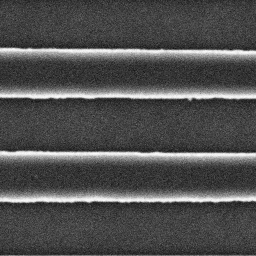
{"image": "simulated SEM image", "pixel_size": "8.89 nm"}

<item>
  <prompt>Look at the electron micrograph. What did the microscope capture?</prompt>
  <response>lines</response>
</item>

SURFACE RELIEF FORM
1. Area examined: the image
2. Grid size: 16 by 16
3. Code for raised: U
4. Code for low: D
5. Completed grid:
DDDDDDDDDDDDDDDD
DDDDDDDDDDDDDDDD
DDDDDDDDDDDDDDDD
UUUUUUUUUUUUUUUU
UUUUUUUUUUUUUUUU
UUUUUUUUUUUUUUUU
DDDDDDDDDDDDDDDD
DDDDDDDDDDDDDDDD
DDDDDDDDDDDDDDDD
DDDDDDDDDDDDDDDD
UUUUUUUUUUUUUUUU
UUUUUUUUUUUUUUUU
UUUUUUUUUUUUUUUU
DDDDDDDDDDDDDDDD
DDDDDDDDDDDDDDDD
DDDDDDDDDDDDDDDD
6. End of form